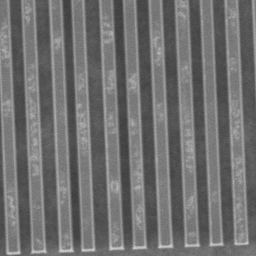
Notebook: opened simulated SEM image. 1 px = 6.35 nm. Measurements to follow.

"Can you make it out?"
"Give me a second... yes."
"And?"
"parallel lines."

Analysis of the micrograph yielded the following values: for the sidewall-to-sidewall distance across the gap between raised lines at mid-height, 81.6 nanometers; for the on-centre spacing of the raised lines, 161 nanometers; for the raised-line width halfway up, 80.9 nm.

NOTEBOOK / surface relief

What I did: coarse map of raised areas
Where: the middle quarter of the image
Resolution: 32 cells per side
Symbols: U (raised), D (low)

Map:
DDDUUUDDDDUUUDDDUUDDDDUUUDDDDUUU
DDDUUUDDDDUUUDDDUUDDDDUUUDDDDUUU
DDDUUUDDDDUUUDDDUUDDDDUUUDDDDUUU
DDDUUUDDDDUUUDDDUUDDDDUUUDDDDUUU
DDDUUUDDDDUUUDDDUUUDDDUUUDDDDUUU
DDDUUUDDDDUUUDDDUUUDDDUUUDDDDUUU
DDDUUUDDDDUUUDDDUUUDDDUUUDDDDUUU
DDDUUUDDDDUUUDDDUUUDDDUUUDDDDUUU
DDDUUUDDDDUUUDDDUUUDDDUUUDDDDUUU
DDDUUUDDDDUUUDDDUUUDDDUUUDDDDUUU
UDDUUUDDDDUUUDDDUUUDDDUUUDDDDUUU
UDDUUUDDDDUUUDDDUUUDDDUUUDDDDUUU
UDDUUUDDDDUUUDDDUUUDDDDUUUDDDUUU
UDDUUUDDDDUUUDDDUUUDDDDUUUDDDUUU
UDDUUUDDDDUUUDDDUUUDDDDUUUDDDUUU
UDDUUUDDDDUUUDDDUUUDDDDUUUDDDUUU
UDDUUUDDDDUUUDDDUUUDDDDUUUDDDUUU
UDDUUUDDDDUUUDDDUUUDDDDUUUDDDUUU
UDDUUUDDDDUUUDDDUUUDDDDUUUDDDUUU
UDDUUUDDDDDUUDDDUUUDDDDUUUDDDUUU
UDDUUUDDDDDUUUDDUUUDDDDUUUDDDDUU
UDDUUUDDDDDUUUDDUUUDDDDUUUDDDDUU
UDDDUUDDDDDUUUDDDUUDDDDUUUDDDDUU
UDDDUUUDDDDUUUDDDUUDDDDUUUDDDDUU
UDDDUUUDDDDUUUDDDUUDDDDUUUDDDDUU
UDDDUUUDDDDUUUDDDUUDDDDUUUDDDDUU
UDDDUUUDDDDUUUDDDUUDDDDUUUDDDDUU
UDDDUUUDDDDUUUDDDUUDDDDUUUDDDDUU
UDDDUUUDDDDUUUDDDUUUDDDUUUDDDDUU
UDDDUUUDDDDUUUDDDUUUDDDUUUDDDDUU
UDDDUUUDDDDUUUDDDUUUDDDUUUDDDDUU
UDDDUUUDDDDUUUDDDUUUDDDUUUDDDDUU